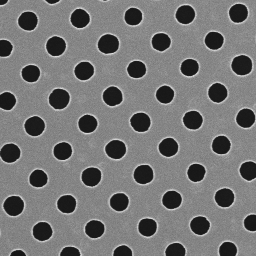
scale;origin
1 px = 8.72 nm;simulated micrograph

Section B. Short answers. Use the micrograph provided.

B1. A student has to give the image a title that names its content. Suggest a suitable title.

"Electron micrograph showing a regular array of holes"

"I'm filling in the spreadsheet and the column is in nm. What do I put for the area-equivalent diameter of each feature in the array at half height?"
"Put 166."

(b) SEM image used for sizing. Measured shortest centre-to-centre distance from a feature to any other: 36.7 pixels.